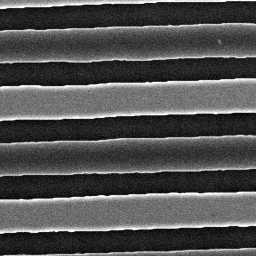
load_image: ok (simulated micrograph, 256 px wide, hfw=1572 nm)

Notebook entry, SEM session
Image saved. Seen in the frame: lines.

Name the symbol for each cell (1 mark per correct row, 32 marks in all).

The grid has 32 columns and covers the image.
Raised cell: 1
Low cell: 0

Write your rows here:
11111111111000000000000000000000
00000000000000000000000000000000
00000000000000000000000000000000
00000000000001111111111111111111
11111111111111111111111111111111
11111111111111111111111111111111
11111111111111111111111111111111
11111111111111111110000000000000
00000000000000000000000000000000
00000000000000000000000000000000
00000000000001111111111111111111
11111111111111111111111111111111
11111111111111111111111111111111
11111111111111111111111111111111
11111111111111100000000000000000
00000000000000000000000000000000
00000000000000000000000000000000
00000000000001111111111111111111
11111111111111111111111111111111
11111111111111111111111111111111
11111111111111111111111111111111
11111111111111111111000000000000
00000000000000000000000000000000
00000000000000000000000000000000
00000000000011111111111111111111
11111111111111111111111111111111
11111111111111111111111111111111
11111111111111111111111111111111
11111111111111111111000000000000
00000000000000000000000000000000
00000000000000000000000000000000
00000000000000000000011111111111